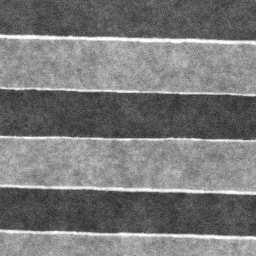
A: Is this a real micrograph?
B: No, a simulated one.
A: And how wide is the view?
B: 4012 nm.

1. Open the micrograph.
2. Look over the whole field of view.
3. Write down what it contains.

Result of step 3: lines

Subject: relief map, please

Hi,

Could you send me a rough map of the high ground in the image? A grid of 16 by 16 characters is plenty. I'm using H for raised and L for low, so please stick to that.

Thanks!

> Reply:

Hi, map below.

LLLLLLLLLLLLLLLL
LLLLLLLLLLLLLLLL
HHHHHHHHLLLLLLLL
HHHHHHHHHHHHHHHH
HHHHHHHHHHHHHHHH
HHHHHHHHHHHHHHHH
LLLLLLLLLLLLLLLL
LLLLLLLLLLLLLLLL
LLLLLLLLLLLLLLLL
HHHHHHHHHHHHHHHH
HHHHHHHHHHHHHHHH
HHHHHHHHHHHHHHHH
LLLLLLLLLLLLLLLL
LLLLLLLLLLLLLLLL
HLLLLLLLLLLLLLLL
HHHHHHHHHHHHHHHH